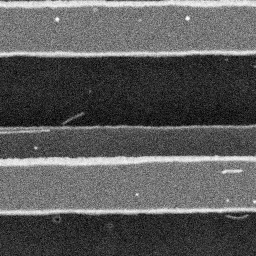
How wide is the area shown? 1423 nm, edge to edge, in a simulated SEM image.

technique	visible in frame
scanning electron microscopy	lines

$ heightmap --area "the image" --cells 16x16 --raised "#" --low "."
################
################
################
................
................
................
................
................
................
................
################
################
################
................
................
................